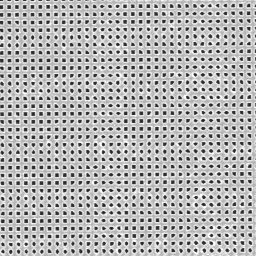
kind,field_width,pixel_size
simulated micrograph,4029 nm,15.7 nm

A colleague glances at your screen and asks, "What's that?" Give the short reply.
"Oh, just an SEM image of a regular array of holes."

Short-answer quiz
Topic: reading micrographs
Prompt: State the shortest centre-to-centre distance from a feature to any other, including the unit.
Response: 114 nanometers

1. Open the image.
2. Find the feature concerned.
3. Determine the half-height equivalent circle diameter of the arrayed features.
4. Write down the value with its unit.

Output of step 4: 68.8 nanometres